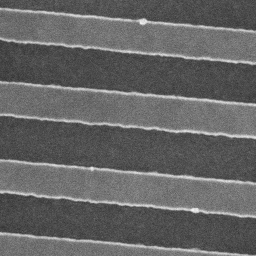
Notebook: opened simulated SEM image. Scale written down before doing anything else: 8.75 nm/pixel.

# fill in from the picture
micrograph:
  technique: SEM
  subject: lines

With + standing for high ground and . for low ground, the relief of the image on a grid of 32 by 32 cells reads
................................
++++++..........................
++++++++++++++++++..............
++++++++++++++++++++++++++++....
++++++++++++++++++++++++++++++++
....++++++++++++++++++++++++++++
...............+++++++++++++++++
..........................++++++
................................
................................
++++............................
+++++++++++++++.................
++++++++++++++++++++++++++......
++++++++++++++++++++++++++++++++
.+++++++++++++++++++++++++++++++
...........+++++++++++++++++++++
.......................+++++++++
................................
................................
................................
++++++..........................
+++++++++++++++++...............
++++++++++++++++++++++++++++....
++++++++++++++++++++++++++++++++
....++++++++++++++++++++++++++++
..............++++++++++++++++++
........................++++++++
................................
................................
+++++...........................
+++++++++++++++.................
++++++++++++++++++++++++++......